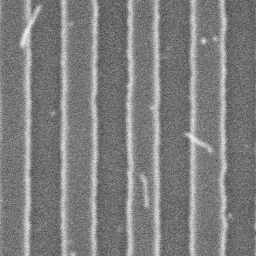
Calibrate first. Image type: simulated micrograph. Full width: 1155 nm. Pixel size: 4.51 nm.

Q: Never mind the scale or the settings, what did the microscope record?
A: lines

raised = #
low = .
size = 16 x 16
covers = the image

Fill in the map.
##..##..##..##..
##..##..##..##..
##..##..##..##..
##..##..##..##..
##..##..##..##..
##..##..##..##..
##..##..##..##..
##..##..##..##..
##..##..##..##..
##..##..##..##..
##..##..##..##..
##..##..##..##..
##..##..##..##..
##..##..##..##..
##..##..##..##..
##..##..##..##..